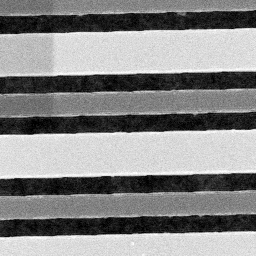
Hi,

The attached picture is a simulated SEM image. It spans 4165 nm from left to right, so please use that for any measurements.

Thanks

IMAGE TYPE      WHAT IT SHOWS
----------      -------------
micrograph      lines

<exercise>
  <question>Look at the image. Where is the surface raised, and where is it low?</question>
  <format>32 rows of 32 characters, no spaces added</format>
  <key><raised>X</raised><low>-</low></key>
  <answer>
XXXXXXXXXXXXXXXXXXXXXXXXXXXXXXXX
XXXXXXXXXXXXXXXXXXXXX-----------
--------------------------------
--------------------------------
XXXXXXXXXXXXXXXXXXXXXXXXXXXXXXXX
XXXXXXXXXXXXXXXXXXXXXXXXXXXXXXXX
XXXXXXXXXXXXXXXXXXXXXXXXXXXXXXXX
XXXXXXXXXXXXXXXXXXXXXXXXXXXXXXXX
XXXXXXXXXXXXXXXXXXXXXXXXXXXXXXXX
--------------------------------
--------------------------------
----------------XXXXXXXXXXXXXXXX
XXXXXXXXXXXXXXXXXXXXXXXXXXXXXXXX
XXXXXXXXXXXXXXXXXXXXXXXXXXXXXXXX
XXXX----------------------------
--------------------------------
----------------------XXXXXXXXXX
XXXXXXXXXXXXXXXXXXXXXXXXXXXXXXXX
XXXXXXXXXXXXXXXXXXXXXXXXXXXXXXXX
XXXXXXXXXXXXXXXXXXXXXXXXXXXXXXXX
XXXXXXXXXXXXXXXXXXXXXXXXXXXXXXXX
XXXXXXXXXXXXXXXXXXXXXXXXXXXXXXXX
--------------------------------
--------------------------------
---XXXXXXXXXXXXXXXXXXXXXXXXXXXXX
XXXXXXXXXXXXXXXXXXXXXXXXXXXXXXXX
XXXXXXXXXXXXXXXXXXXXXXXXXXXXXXXX
--------------------------------
--------------------------------
------------XXXXXXXXXXXXXXXXXXXX
XXXXXXXXXXXXXXXXXXXXXXXXXXXXXXXX
XXXXXXXXXXXXXXXXXXXXXXXXXXXXXXXX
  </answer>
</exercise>